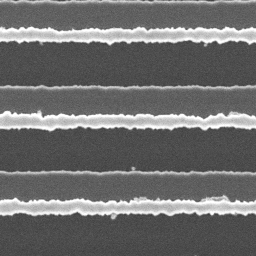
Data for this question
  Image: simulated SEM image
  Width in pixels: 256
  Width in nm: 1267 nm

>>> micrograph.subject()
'lines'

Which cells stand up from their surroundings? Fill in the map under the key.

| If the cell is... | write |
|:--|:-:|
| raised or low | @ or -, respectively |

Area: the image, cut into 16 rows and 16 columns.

@@@@@@@@@@@@@@@@
@@@@@@@@@@@@@@@@
@@@@@@@@@@@@@@@@
----------------
----------------
@@@@@@@@@@@@@@@@
@@@@@@@@@@@@@@@@
@@@@@@@@@@@@@@@@
----------------
----------------
----------------
@@@@@@@@@@@@@@@@
@@@@@@@@@@@@@@@@
----------------
----------------
----------------